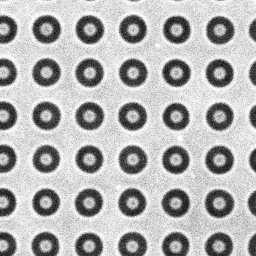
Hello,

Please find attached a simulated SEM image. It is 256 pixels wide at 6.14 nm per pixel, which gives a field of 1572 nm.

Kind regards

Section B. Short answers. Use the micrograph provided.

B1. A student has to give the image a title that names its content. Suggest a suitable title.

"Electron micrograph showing an array of small figures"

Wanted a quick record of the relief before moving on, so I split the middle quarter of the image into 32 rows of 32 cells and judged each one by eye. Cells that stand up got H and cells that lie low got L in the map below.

HHHLLLLLLLHHHHLLLLLLLHHHHLLLLLLH
HHHLLHHHLLHHHHLLHHLLLHHHLLLHHLLL
HHHLLHHHLLHHHHLLHHLLLHHHLLLHHLLL
HHHLLLHLLLHHHHLLLLLLLHHHHLLLLLLL
HHHLLLLLLLHHHHLLLLLLHHHHHLLLLLLH
HHHHLLLLHHHHHHHLLLLHHHHHHHLLLLHH
HHHHHHHHHHHHHHHHHHHHHHHHHHHHHHHH
HHHHHHHHHHHHHHHHHHHHHHHHHHHHHHHH
HHHHHHHHHHHHHHHHHHHHHHHHHHHHHHHH
HHHHHHLHHHHHHHHHLLHHHHHHHHHHHHHH
HHHHLLLLLHHHHHLLLLLLHHHHHHLLLLHH
HHHLLLLLLLHHHHLLLLLLHHHHHLLLLLLH
HHHLLHHLLLHHHLLLHHLLLHHHLLLHHLLH
HHHLLHHLLLHHHLLLHHLLLHHHLLLHHLLL
HHHLLLLLLLHHHHLLLLLLLHHHHLLLLLLH
HHHHLLLLLHHHHHLLLLLLHHHHHLLLLLLH
HHHHHLLLHHHHHHHLLLLHHHHHHHHLLLHH
HHHHHHHHHHHHHHHHHHHHHHHHHHHHHHHH
HHHHHHHHHHHHHHHHHHHHHHHHHHHHHHHH
HHHHHHHHHHHHHHHHHHHHHHHHHHHHHHHH
HHHHLLLLHHHHHHHHLLLHHHHHHHHLLHHH
HHHLLLLLLHHHHHLLLLLLHHHHHLLLLLLH
HHHLLLHLLLHHHHLLLLLLLHHHHLLLLLLH
HHHLLHHHLLHHHLLLHHLLLHHHLLLHHLLL
HHHLLHHLLLHHHLLLHHLLLHHHLLLHHLLL
HHHLLLLLLLHHHHLLLLLLLHHHHLLLLLLH
HHHHLLLLLHHHHHLLLLLLHHHHHLLLLLLH
HHHHHHLHHHHHHHHLLLLHHHHHHHHLLHHH
HHHHHHHHHHHHHHHHHHHHHHHHHHHHHHHH
HHHHHHHHHHHHHHHHHHHHHHHHHHHHHHHH
HHHHHHHHHHHHHHHHHHHHHHHHHHHHHHHH
HHHHLLLLHHHHHHHLLLLHHHHHHHLLLLHH